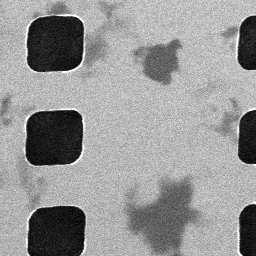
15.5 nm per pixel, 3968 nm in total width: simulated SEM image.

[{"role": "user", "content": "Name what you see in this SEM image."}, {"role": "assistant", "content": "holes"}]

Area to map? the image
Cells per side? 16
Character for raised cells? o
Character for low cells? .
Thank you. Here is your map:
oooooooooooooooo
oo...oooooooooo.
oo...oooooooooo.
oo...oooooooooo.
oooooooooooooooo
oooooooooooooooo
oooooooooooooooo
oo...oooooooooo.
oo...oooooooooo.
oo...oooooooooo.
oooooooooooooooo
oooooooooooooooo
oooooooooooooooo
oo...oooooooooo.
oo...oooooooooo.
oo...oooooooooo.